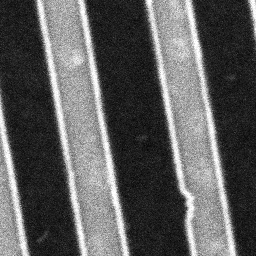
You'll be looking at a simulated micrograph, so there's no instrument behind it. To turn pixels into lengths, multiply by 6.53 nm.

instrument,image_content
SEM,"one or a few lines or trenches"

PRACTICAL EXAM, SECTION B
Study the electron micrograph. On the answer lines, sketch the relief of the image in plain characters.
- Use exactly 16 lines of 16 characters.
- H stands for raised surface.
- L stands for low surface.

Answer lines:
HHHLLHHHHLLLHHHH
HHHLLHHHHHLLHHHH
HHHLLHHHHHLLHHHH
HHHLLLHHHHLLHHHH
HHHLLLHHHHLLLHHH
HHHHLLHHHHLLLHHH
HHHHLLHHHHHLLHHH
HHHHLLHHHHHLLHHH
HHHHLLHHHHHLLHHH
HHHHLLLHHHHLLHHH
LHHHLLLHHHHLLLHH
LHHHHLLHHHHLLLHH
LHHHHLLHHHHHLLHH
LHHHHLLHHHHHLLHH
LHHHHLLLHHHHLLHH
LHHHHLLLHHHHLLHH